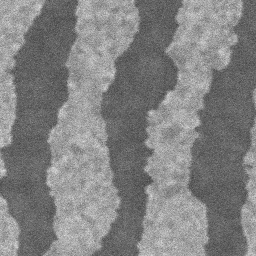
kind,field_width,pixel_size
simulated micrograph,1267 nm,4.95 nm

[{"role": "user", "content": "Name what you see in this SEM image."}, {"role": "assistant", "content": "one or a few lines or trenches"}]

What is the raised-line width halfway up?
256 nm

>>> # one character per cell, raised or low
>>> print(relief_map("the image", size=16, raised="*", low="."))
***..***...****.
**...****..****.
*....***...****.
*...***....***..
*...***....**...
*...***....**...
*...**....***...
*...**...***....
*..****..***....
...****..***....
...****..***...*
...****..***....
...****..***...*
*...***..****..*
*...***..****..*
*..***...****...